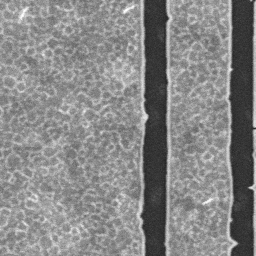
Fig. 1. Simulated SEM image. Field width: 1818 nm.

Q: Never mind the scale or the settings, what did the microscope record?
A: one or a few lines or trenches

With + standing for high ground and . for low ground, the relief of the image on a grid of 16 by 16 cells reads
+++++++++..+++..
+++++++++..+++..
+++++++++..+++..
+++++++++..+++..
+++++++++..+++..
+++++++++..+++..
+++++++++..+++..
+++++++++..+++..
+++++++++..+++..
+++++++++..+++..
+++++++++..+++..
+++++++++..+++..
+++++++++..+++..
+++++++++..+++..
+++++++++..+++..
+++++++++.++++..